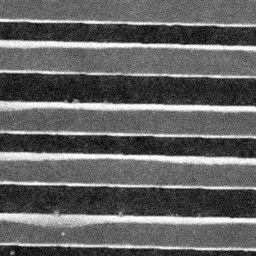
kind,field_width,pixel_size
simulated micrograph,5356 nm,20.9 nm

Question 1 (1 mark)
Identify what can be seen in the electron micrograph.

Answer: lines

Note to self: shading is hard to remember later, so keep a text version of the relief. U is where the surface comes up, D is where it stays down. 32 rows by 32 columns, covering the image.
UUUUUUUUUUUUUUUUUUUUUUUUUUUUUUUU
UUUUUUUUUUUUUUUUUUUUUUUUUUUUUUUU
UUUUUUUUUUUUUUUUUUUUUUUUUUUUUUUU
DDDDDDDDDDDDDDDDDDDDDDDDDDDDDDDD
DDDDDDDDDDDDDDDDDDDDDDDDDDDDDDDD
UUUUUUUUDDDDDDDDDDDDDDDDDDDDDDDD
UUUUUUUUUUUUUUUUUUUUUUUUUUUUUUUU
UUUUUUUUUUUUUUUUUUUUUUUUUUUUUUUU
UUUUUUUUUUUUUUUUUUUUUUUUUUUUUUUU
DDDDDDDDDDDDDDDDDDDDDUUUUUUUUUUU
DDDDDDDDDDDDDDDDDDDDDDDDDDDDDDDD
DDDDDDDDDDDDDDDDDDDDDDDDDDDDDDDD
DDDDDDDDDDDDDDDDDDDDDDDDDDDDDDDD
UUUUUUUUUUUUUUUUUUUUUUUUUUUDDDDD
UUUUUUUUUUUUUUUUUUUUUUUUUUUUUUUU
UUUUUUUUUUUUUUUUUUUUUUUUUUUUUUUU
UUUUUUUUUUUUUUUUUUUUUUUUUUUUUUUU
DDDDDDDDDDDDDDDDDDDDDDDDDDDDDDDD
DDDDDDDDDDDDDDDDDDDDDDDDDDDDDDDD
UUUUUUUUUUUUUUUDDDDDDDDDDDDDDDDD
UUUUUUUUUUUUUUUUUUUUUUUUUUUUUUUU
UUUUUUUUUUUUUUUUUUUUUUUUUUUUUUUU
UUUUUUUUUUUUUUUUUUUUUUUUUUUUUUUU
DDDDDDDDDDDDDDDDDDDDDDDDDUUUUUUU
DDDDDDDDDDDDDDDDDDDDDDDDDDDDDDDD
DDDDDDDDDDDDDDDDDDDDDDDDDDDDDDDD
DDDDDDDDDDDDDDDDDDDDDDDDDDDDDDDD
UUUUUUUUUUUUUUUUUUUUUUUUUUUUUUUU
UUUUUUUUUUUUUUUUUUUUUUUUUUUUUUUU
UUUUUUUUUUUUUUUUUUUUUUUUUUUUUUUU
UUUUUUUUUUUUUUUUUUUUUUUUUUUUUUUU
DDDDDDDDDDDDDDDDDDDDDDDDDDDDDDDD